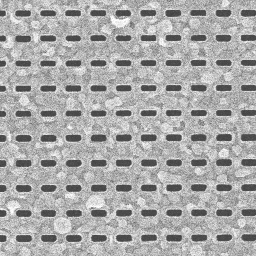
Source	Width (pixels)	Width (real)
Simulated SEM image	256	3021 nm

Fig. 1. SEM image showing a regular array of holes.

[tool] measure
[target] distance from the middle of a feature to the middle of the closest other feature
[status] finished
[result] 0.294 micrometres